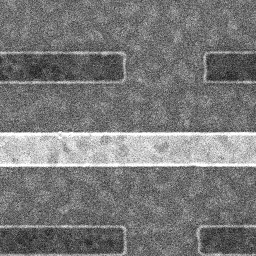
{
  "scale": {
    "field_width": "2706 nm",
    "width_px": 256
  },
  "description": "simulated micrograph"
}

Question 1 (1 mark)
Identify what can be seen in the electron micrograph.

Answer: one or a few lines or trenches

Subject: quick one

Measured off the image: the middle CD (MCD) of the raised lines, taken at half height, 307 nanometers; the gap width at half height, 0.64 microns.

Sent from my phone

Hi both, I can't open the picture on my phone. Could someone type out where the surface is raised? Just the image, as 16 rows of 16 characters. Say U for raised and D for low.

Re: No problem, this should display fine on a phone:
DDDDDDDDDDDDDDDD
DDDDDDDDDDDDDDDD
DDDDDDDDDDDDDDDD
UUUUUUUUDDDDDUUU
UUUUUUUUDDDDDUUU
DDDDDDDDDDDDDDDD
DDDDDDDDDDDDDDDD
DDDDDDDDDDDDDDDD
UUUUUUUUUUUUUUUU
UUUUUUUUUUUUUUUU
DDDDDDDDDDDDDDDD
DDDDDDDDDDDDDDDD
DDDDDDDDDDDDDDDD
DDDDDDDDDDDDDDDD
UUUUUUUUDDDDDUUU
UUUUUUUUDDDDDUUU